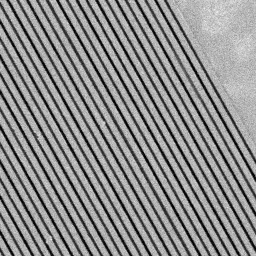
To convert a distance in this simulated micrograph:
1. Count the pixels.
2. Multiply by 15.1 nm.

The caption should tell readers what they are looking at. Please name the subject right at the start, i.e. parallel lines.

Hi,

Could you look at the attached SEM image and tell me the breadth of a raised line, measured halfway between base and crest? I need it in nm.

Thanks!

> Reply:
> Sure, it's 94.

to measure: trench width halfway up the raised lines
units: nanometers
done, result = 41.2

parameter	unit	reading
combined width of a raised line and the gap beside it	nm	130